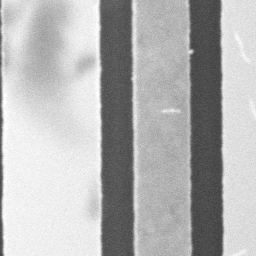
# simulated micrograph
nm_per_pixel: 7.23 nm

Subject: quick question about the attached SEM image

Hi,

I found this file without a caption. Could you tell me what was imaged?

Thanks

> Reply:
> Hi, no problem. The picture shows lines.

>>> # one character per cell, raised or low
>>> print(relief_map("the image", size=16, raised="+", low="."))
++++++..++++..++
++++++..++++..++
++++++..++++..++
++++++..++++..++
++++++..++++..++
++++++..++++..++
++++++..++++..++
++++++..++++..++
++++++..++++..++
++++++..++++..++
++++++..++++..++
++++++..++++..++
++++++..++++..++
++++++..++++..++
++++++..++++..++
++++++..++++..++